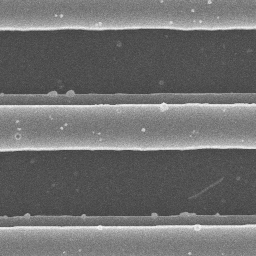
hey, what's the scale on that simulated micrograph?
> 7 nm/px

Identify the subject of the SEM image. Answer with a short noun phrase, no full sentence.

lines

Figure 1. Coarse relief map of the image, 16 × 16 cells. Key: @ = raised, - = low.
@@@@@@@@@@@@@@@@
@@@@@@@@@@@@@@@@
----------------
----------------
----------------
----------------
@@@@@@@@@@@@@@@@
@@@@@@@@@@@@@@@@
@@@@@@@@@@@@@@@@
----------------
----------------
----------------
----------------
-@---@---@-@@@@@
@@@@@@@@@@@@@@@@
@@@@@@@@@@@@@@@@